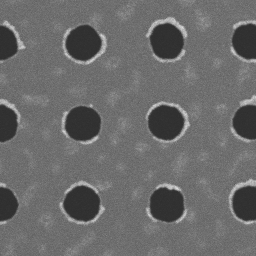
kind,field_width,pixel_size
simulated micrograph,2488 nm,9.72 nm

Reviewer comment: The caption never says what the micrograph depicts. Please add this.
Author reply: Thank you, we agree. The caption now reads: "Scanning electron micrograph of holes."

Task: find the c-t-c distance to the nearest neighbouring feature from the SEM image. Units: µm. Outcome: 0.788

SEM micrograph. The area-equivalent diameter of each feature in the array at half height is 0.346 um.